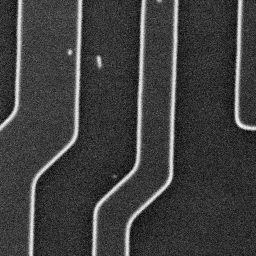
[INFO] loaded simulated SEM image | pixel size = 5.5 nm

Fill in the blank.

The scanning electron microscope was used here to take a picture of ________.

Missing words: groups of lines, slits or small figures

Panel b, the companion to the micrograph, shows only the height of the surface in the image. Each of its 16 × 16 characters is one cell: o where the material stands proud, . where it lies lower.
.oooo....oo....o
.oooo....oo....o
.oooo....oo....o
.oooo....oo....o
.oooo....oo....o
.oooo....oo....o
.oooo....oo....o
ooooo....oo....o
ooooo....oo.....
oooo.....oo.....
ooo.....ooo.....
oo.....ooo......
oo....oooo......
oo....oo........
oo....oo........
oo....oo........